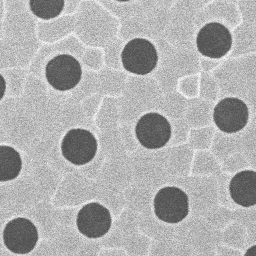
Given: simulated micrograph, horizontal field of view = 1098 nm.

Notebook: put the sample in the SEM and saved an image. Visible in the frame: a regular array of holes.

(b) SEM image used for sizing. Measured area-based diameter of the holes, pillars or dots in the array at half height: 154 nanometres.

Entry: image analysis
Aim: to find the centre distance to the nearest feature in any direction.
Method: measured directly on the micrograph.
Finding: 75.4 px